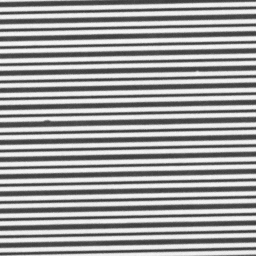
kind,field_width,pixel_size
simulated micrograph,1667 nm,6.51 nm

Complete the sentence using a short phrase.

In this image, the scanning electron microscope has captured parallel lines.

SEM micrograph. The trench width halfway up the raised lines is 3.75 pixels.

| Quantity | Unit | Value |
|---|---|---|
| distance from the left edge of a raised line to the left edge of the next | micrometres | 0.0559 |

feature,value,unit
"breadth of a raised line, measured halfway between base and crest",0.0244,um